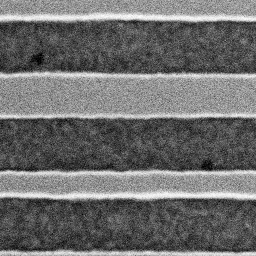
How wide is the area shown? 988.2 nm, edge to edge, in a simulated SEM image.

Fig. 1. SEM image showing lines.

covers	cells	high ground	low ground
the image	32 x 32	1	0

11111111111111111111111111111111
11111111111111111111111111111111
00000000000000000000000000000001
00000000000000000000000000000000
00000000000000000000000000000000
00000000000000000000000000000000
00000000000000000000000000000000
00000000000000000000000000000000
00000000000000000000000000000000
11111111111111111111111111111111
11111111111111111111111111111111
11111111111111111111111111111111
11111111111111111111111111111111
11111111111111111111111111111111
11111111111111111111111111111111
00000000000000000000000000000000
00000000000000000000000000000000
00000000000000000000000000000000
00000000000000000000000000000000
00000000000000000000000000000000
00000000000000000000000000000000
11111111001111111111110111111111
11111111111111111111111111111111
11111111111111111111111111111111
10111111111111111111111111111111
00000000000000000000000000000000
00000000000000000000000000000000
00000000000000000000000000000000
00000000000000000000000000000000
00000000000000000000000000000000
00000000000000000000000000000000
11101011110100100011100000000000